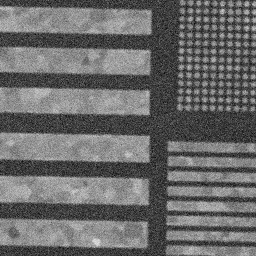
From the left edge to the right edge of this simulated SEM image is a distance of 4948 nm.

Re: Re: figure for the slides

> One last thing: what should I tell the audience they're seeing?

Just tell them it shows groups of lines, slits or small figures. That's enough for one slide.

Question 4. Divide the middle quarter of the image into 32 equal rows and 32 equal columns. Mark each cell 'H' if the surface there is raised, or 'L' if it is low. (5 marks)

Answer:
HHHHHHHHHHHHHHHHHHHHHLLLLLLLLHLH
HHHHHHHHHHHHHHHHHHHHHLLLLLLLLLLL
LLLLLLLLLLLLLLLLLLLLLLLLLLLLLHLH
LLLLLLLLLLLLLLLLLLLLLLLLLLLLLLLL
LLLLLLLLLLLLLLLLLLLLLLLLLLLLLLLL
LLLLLLLLLLLLLLLLLLLLLLLLLLLLLLLL
HHHHLLLLLLLLLLLLLLLLLLLLLLLLLLLL
HHHHHHHHHHHHHHHHHHHHHLLLLLLLLLLL
HHHHHHHHHHHHHHHHHHHHHLLLLLLLLLLL
HHHHHHHHHHHHHHHHHHHHHLLLLLLLLLLL
HHHHHHHHHHHHHHHHHHHHHLLLLLLLLHLL
HHHHHHHHHHHHHHHHHHHHHLLLLLLLLLLL
LLLLLLLLLLLLLLLLLLLLLLLLLLLLLLLL
LLLLLLLLLLLLLLLLLLLLLLLLLLLLLLLL
LLLLLLLLLLLLLLLLLLLLLLLLLLLLLLLL
LLLLLLLLLLLLLLLLLLLLLLLLLLLLLLLL
LLLLLLLLLLLLLLLLLLLLLLLLLLLLLLLL
LLLLLLLLLLLLLLLLLLLLLLLLLLLLLLLL
HHHHHHHHHHHHHHHHHHHHHLLLLLLLLLLL
HHHHHHHHHHHHHHHHHHHHHLLLLLLLLLLL
HHHHHHHHHHHHHHHHHHHHHLLLLLHHHHHH
HHHHHHHHHHHHHHHHHHHHHLLLLLHHHHHH
HHHHHHHHHHHHHHHHHHHHHLLLLLLLLLLL
HHHHHHHHHHHHHHHHHHHHHLLLLLHHHHHH
LLLLLLLLLLLLLLLLLLLLLLLLLLHHHHHH
LLLLLLLLLLLLLLLLLLLLLLLLLLLLLLLL
LLLLLLLLLLLLLLLLLLLLLLLLLLLLLLLL
LLLLLLLLLLLLLLLLLLLLLLLLLLHHHHHH
LLLLLLLLLLLLLLLLLLLLLLLLLLHHHHHH
HHHHHHHHHHHHHHHHHHHHHLLLLLLLLLLL
HHHHHHHHHHHHHHHHHHHHHLLLLLLLLLLL
HHHHHHHHHHHHHHHHHHHHHLLLLLHHHHHH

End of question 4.